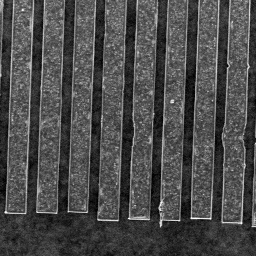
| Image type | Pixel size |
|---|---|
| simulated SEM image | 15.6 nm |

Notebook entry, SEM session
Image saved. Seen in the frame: parallel lines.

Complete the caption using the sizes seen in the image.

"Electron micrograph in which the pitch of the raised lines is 30.9 pixels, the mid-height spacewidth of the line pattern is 168 nm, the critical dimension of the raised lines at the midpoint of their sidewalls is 320 nm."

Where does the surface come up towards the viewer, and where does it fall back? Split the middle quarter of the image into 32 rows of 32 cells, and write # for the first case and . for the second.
..#####...#####...#####...####..
..#####...#####...#####...####..
..#####...#####...#####...####..
..#####...#####...#####...####..
..#####...#####...#####..#####..
..#####...#####...#####..#####..
..#####...#####...####...#####..
..#####...#####...####...#####..
..#####...#####...####...#####..
..#####...#####..#####...#####..
..#####...#####..#####...#####..
..#####...####...#####...##..#..
..#####...####...#####...##..#..
..#####...####...#####...#####..
..#####..#####...#####...#####..
..#####..#####...#####...#####..
..#####..#####....####...#####..
..####...#####....####...#####..
..####...#####...#####...#####..
..####...#####...##.##...#####..
..####...#####...##.##...#####..
..####...#####...#####...#.###..
..####...#####...#####...####...
..####...#####...#####...####...
..####...#####...#####...####...
.#####...#####...#####..#####...
.#####...#####...#####..#####...
.#####...#####...#####..#####...
.#####...#####...#####..#####...
.#####...#####...#####..#####...
.#####...#####...#####..#####...
.#####...#.###...#####..#####...